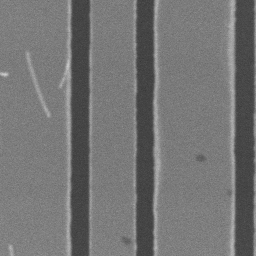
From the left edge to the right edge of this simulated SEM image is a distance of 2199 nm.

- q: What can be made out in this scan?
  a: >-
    lines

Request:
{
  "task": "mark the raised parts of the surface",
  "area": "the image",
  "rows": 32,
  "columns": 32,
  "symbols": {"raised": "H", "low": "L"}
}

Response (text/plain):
HHHHHHHHHLLHHHHHHLLHHHHHHHHHHLLL
HHHHHHHHHLLHHHHHHLLHHHHHHHHHHLLL
HHHHHHHHHLLHHHHHHLLHHHHHHHHHHLLL
HHHHHHHHHLLHHHHHHLLHHHHHHHHHHLLL
HHHHHHHHHLLHHHHHHLLHHHHHHHHHHLLL
HHHHHHHHHLLHHHHHHLLHHHHHHHHHHLLL
HHHHHHHHHLLHHHHHHLLHHHHHHHHHHLLL
HHHHHHHHHLLHHHHHHLLHHHHHHHHHHLLL
HHHHHHHHHLLHHHHHHLLHHHHHHHHHHLLL
HHHHHHHHHLLHHHHHHLLHHHHHHHHHHLLL
HHHHHHHHHLLHHHHHHLLHHHHHHHHHHLLL
HHHHHHHHHLLHHHHHHLLHHHHHHHHHHLLL
HHHHHHHHHLLHHHHHHLLHHHHHHHHHHLLL
HHHHHHHHHLLHHHHHHLLHHHHHHHHHHLLL
HHHHHHHHHLLHHHHHHLLHHHHHHHHHHLLL
HHHHHHHHHLLHHHHHHLLHHHHHHHHHHLLL
HHHHHHHHHLLHHHHHHLLHHHHHHHHHHLLL
HHHHHHHHHLLHHHHHHLLHHHHHHHHHHLLL
HHHHHHHHHLLHHHHHHLLHHHHHHHHHHLLL
HHHHHHHHHLLHHHHHHLLHHHHHHHHHHLLL
HHHHHHHHHLLHHHHHHLLHHHHHHHHHHLLL
HHHHHHHHHLLHHHHHHLLHHHHHHHHHHLLL
HHHHHHHHHLLHHHHHHLLHHHHHHHHHHLLL
HHHHHHHHHLLHHHHHHLLHHHHHHHHHHLLL
HHHHHHHHHLLHHHHHHLLHHHHHHHHHHLLL
HHHHHHHHHLLHHHHHHLLHHHHHHHHHHLLL
HHHHHHHHHLLHHHHHHLLHHHHHHHHHHLLL
HHHHHHHHHLLHHHHHHLLHHHHHHHHHHLLL
HHHHHHHHHLLHHHHHHLLHHHHHHHHHHLLL
HHHHHHHHHLLHHHHHHLLHHHHHHHHHHLLL
HHHHHHHHHLLHHHHHHLLHHHHHHHHHHLLL
HHHHHHHHHLLHHHHHHLLHHHHHHHHHHLLL